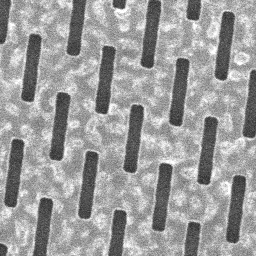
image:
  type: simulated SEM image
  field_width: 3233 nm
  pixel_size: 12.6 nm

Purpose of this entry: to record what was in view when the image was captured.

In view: a regular array of holes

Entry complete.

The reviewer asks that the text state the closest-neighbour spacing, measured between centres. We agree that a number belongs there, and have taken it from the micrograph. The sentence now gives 0.823 um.